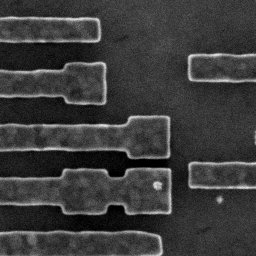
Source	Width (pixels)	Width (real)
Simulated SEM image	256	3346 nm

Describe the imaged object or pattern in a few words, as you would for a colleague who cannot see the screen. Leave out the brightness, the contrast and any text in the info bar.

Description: wiring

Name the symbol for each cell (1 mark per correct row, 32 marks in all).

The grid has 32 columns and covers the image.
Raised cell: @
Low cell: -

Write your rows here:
--------------------------------
--------------------------------
@@@@@@@@@@@@--------------------
@@@@@@@@@@@@@-------------------
@@@@@@@@@@@@@-------------------
--------------------------------
--------------------------------
------------------------@@@@@@@@
--------@@@@@-----------@@@@@@@@
@@@@@@@@@@@@@-----------@@@@@@@@
@@@@@@@@@@@@@-------------------
@@@@@@@@@@@@@-------------------
--------@@@@@-------------------
--------------------------------
-------------------@@-----------
-@-------------@@@@@@-----------
@@@@@@@@@@@@@@@@@@@@@-----------
@@@@@@@@@@@@@@@@@@@@@-----------
@@@@@@@@@@@@@@@@@@@@@-----------
----------------@@@@@-----------
------------------------@@@@@@@@
--------@@@@@---@@@@@---@@@@@@@@
@@@@@@@@@@@@@@@@@@@@@---@@@@@@@@
@@@@@@@@@@@@@@@@@@@@@----@@@----
@@@@@@@@@@@@@@@@@@@@@-----------
@@@@@@@@@@@@@@@@@@@@@-----------
--------@@@@@---@@@@@-----------
--------------------------------
--------------------------------
@@@@@@@@@@@@@@@@@@@@------------
@@@@@@@@@@@@@@@@@@@@------------
@@@@@@@@@@@@@@@@@@@@------------